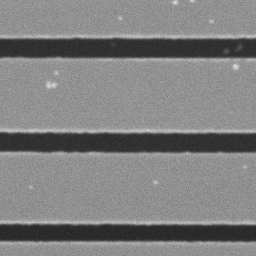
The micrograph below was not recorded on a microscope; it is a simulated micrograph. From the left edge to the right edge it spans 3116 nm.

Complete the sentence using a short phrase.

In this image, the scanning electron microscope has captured lines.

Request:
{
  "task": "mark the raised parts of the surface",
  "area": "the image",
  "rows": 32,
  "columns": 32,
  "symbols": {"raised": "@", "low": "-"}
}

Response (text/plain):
@@@@@@@@@@@@@@@@@@@@@@@@@@@@@@@@
@@@@@@@@@@@@@@@@@@@@@@@@@@@@@@@@
@@@@@@@@@@@@@@@@@@@@@@@@@@@@@@@@
@@@@@@@@@@@@@@@@@@@@@@@@@@@@@@@@
@@@@@@@@@@@@@@@@@@@@@@@@@@@@@@@@
--------------------------------
--------------------------------
@@@@@@@@@@@@@@@@@@@@@@@@@@@@@@@@
@@@@@@@@@@@@@@@@@@@@@@@@@@@@@@@@
@@@@@@@@@@@@@@@@@@@@@@@@@@@@@@@@
@@@@@@@@@@@@@@@@@@@@@@@@@@@@@@@@
@@@@@@@@@@@@@@@@@@@@@@@@@@@@@@@@
@@@@@@@@@@@@@@@@@@@@@@@@@@@@@@@@
@@@@@@@@@@@@@@@@@@@@@@@@@@@@@@@@
@@@@@@@@@@@@@@@@@@@@@@@@@@@@@@@@
@@@@@@@@@@@@@@@@@@@@@@@@@@@@@@@@
-@-@@@@@@@@@@@@@@@@@@@@@@@@@@@@@
--------------------------------
--------------------------------
@@@@@@@@@@@@@@@@@@@@@@@@@@@@@@@@
@@@@@@@@@@@@@@@@@@@@@@@@@@@@@@@@
@@@@@@@@@@@@@@@@@@@@@@@@@@@@@@@@
@@@@@@@@@@@@@@@@@@@@@@@@@@@@@@@@
@@@@@@@@@@@@@@@@@@@@@@@@@@@@@@@@
@@@@@@@@@@@@@@@@@@@@@@@@@@@@@@@@
@@@@@@@@@@@@@@@@@@@@@@@@@@@@@@@@
@@@@@@@@@@@@@@@@@@@@@@@@@@@@@@@@
@@@@@@@@@@@@@@@@@@@@@@@@@@@@@@@@
--------------------------------
--------------------------------
@@@@@@@@@@@@@@@@@@@@@@@@@@@@@@@@
@@@@@@@@@@@@@@@@@@@@@@@@@@@@@@@@